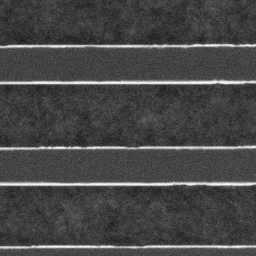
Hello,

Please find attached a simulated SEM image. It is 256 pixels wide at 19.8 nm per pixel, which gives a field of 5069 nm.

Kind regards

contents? lines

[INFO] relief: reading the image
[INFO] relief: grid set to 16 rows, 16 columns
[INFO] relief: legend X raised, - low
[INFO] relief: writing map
----------------
----------------
----------------
XXXXXXXXXXXXXXXX
XXXXXXXXXXXXXXXX
----------------
----------------
----------------
----------------
XXXXXXXXXXXXXXXX
XXXXXXXXXXXXXXXX
XX-XXX--XX------
----------------
----------------
----------------
XXXXXXXXXXXXXXXX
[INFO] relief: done